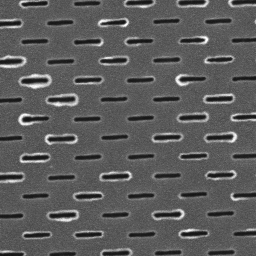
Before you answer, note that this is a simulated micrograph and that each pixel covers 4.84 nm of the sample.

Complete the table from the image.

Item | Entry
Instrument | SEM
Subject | a regular array of holes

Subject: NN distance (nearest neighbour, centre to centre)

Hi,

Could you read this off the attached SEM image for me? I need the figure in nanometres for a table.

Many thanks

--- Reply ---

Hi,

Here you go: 156